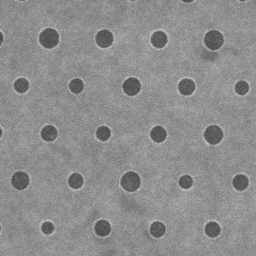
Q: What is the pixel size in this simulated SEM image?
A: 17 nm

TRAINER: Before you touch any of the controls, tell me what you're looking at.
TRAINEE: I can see a regular array of holes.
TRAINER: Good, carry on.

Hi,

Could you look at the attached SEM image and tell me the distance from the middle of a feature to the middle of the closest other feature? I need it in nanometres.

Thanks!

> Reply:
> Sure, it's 927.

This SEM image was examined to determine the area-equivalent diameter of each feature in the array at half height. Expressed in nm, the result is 303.